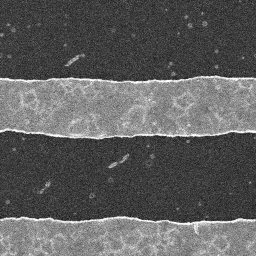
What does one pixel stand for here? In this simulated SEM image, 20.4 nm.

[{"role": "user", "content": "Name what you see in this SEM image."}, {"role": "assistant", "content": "one or a few lines or trenches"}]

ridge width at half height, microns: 1.12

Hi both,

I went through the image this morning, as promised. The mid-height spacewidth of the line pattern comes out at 1750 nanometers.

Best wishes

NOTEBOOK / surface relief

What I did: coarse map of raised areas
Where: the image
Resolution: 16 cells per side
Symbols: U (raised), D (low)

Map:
DDDDDDDDDDDDDDDD
DDDDDDDDDDDDDDDD
DDDDDDDDDDDDDDDD
DDDDDDDDDDDDDDDD
DDDDDDDDDDDDDDDD
UUUUUUUUUUUUUUUU
UUUUUUUUUUUUUUUU
UUUUUUUUUUUUUUUU
DDDUUUUUDDDDDDDD
DDDDDDDDDDDDDDDD
DDDDDDDDDDDDDDDD
DDDDDDDDDDDDDDDD
DDDDDDDDDDDDDDDD
DDDDDDDDDDDDDDDD
UUUUUUUUUUUUUUUU
UUUUUUUUUUUUUUUU